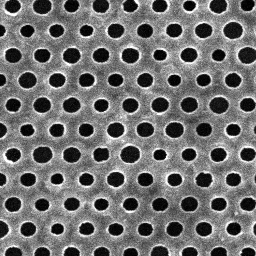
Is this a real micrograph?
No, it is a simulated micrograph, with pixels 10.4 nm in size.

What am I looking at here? a regular array of holes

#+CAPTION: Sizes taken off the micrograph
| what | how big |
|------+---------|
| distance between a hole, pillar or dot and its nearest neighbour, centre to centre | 298 nanometers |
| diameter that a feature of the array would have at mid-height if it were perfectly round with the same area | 160 nm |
